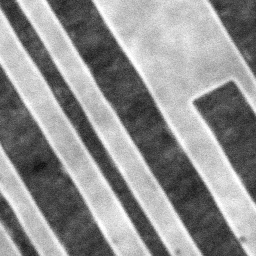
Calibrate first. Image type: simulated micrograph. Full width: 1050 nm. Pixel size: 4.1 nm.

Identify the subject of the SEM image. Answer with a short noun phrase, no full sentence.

groups of lines, slits or small figures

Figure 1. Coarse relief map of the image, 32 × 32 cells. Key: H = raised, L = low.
LLHHHHLLLLLLHHHHHHHHHHHHHHLLLLLL
LLLHHHHLLLLLHHHHHHHHHHHHHHHLLLLL
HLLLHHHLLLLLLHHHHHHHHHHHHHHLLLLL
HLLLHHHHLLLLLLHHHHHHHHHHHHHHLLLL
HHLLLHHHLLLLLLHHHHHHHHHHHHHHHLLL
HHHLLLHHHLLLLLLHHHHHHHHHHHHHHLLL
HHHLLLHHHHLLLLLLHHHHHHHHHHHHHHLL
HHHHLLLHHHLLLLLLHHHHHHHHHHHHHHLL
HHHHHLLHHHHLLLLLLHHHHHHHHHHHHHHL
LHHHHLLLHHHLLLLLLLHHHHHHHHHHHHHH
LLHHHHLLHHHHLLLLLLHHHHHHHHHHLLHH
LLHHHHLLLHHHHLLLLLLHHHHHHHLLLLHH
LLLHHHHLLLHHHLLLLLLHHHHHLLLLLLLH
LLLLHHHHLLHHHHLLLLLLHHHHLLLLLLLL
LLLLHHHHLLLHHHHLLLLLHHHHHLLLLLLL
LLLLLHHHHLLHHHHLLLLLLHHHHHLLLLLL
LLLLLHHHHLLLHHHHLLLLLLHHHHLLLLLL
LLLLLLHHHHLLLHHHLLLLLLHHHHHLLLLL
LLLLLLLHHHHLLHHHHLLLLLLHHHHHLLLL
HLLLLLLHHHHLLLHHHHLLLLLLHHHHLLLL
HLLLLLLLHHHHLLHHHHLLLLLLHHHHHLLL
HHLLLLLLHHHHLLLHHHHLLLLLLHHHHLLL
HHHLLLLLLHHHHLLLHHHHLLLLLHHHHHLL
HHHLLLLLLLHHHHLLHHHHLLLLLLHHHHLL
LHHHLLLLLLHHHHLLLHHHHLLLLLLHHHHL
LHHHLLLLLLLHHHHLLHHHHLLLLLLHHHHH
LLHHHLLLLLLHHHHHLLHHHHLLLLLLHHHH
LLHHHHLLLLLLHHHHLLLHHHLLLLLLHHHH
LLLHHHLLLLLLLHHHHLLHHHHLLLLLLHHH
HLLHHHHLLLLLLHHHHLLLHHHHLLLLLHHH
HHLLHHHLLLLLLLHHHHLLHHHHLLLLLLHH
HHLLLHHHLLLLLLHHHHHLLHHHHLLLLLLH